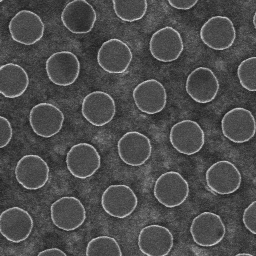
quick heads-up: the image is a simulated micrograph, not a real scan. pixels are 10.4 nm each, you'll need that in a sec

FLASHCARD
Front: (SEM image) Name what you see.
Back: a regular array of raised bodies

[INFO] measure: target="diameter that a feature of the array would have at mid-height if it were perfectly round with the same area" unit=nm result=347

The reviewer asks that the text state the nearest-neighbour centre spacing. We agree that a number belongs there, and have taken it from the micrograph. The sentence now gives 53 px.